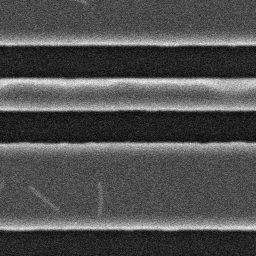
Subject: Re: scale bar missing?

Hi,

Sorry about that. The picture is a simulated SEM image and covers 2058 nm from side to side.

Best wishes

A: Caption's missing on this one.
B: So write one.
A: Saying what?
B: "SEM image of lines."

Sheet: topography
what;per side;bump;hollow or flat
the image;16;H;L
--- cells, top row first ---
HHHHHHHHHHHHHHHH
HHHHHHHHHHHHHHHH
HHHHHHHHHHHHHHHH
LLLLLLLLLLLLLLLL
LLLLLLLLLLLLLLLL
HHHHHHHHHHHHHHHH
HHHHHHHHHHHHHHHH
LLLLLLLLLLLLLLLL
LLLLLLLLLLLLLLLL
HHHHHHHHHHHHHHHH
HHHHHHHHHHHHHHHH
HHHHHHHHHHHHHHHH
HHHHHHHHHHHHHHHH
HHHHHHHHHHHHHHHH
LLLLLLLLLLLLLLLL
LLLLLLLLLLLLLLLL